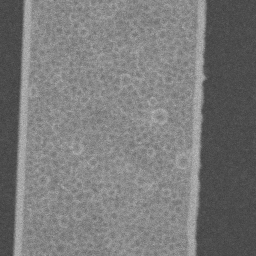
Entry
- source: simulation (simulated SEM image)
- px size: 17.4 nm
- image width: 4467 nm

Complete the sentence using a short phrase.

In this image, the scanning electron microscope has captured one or a few lines or trenches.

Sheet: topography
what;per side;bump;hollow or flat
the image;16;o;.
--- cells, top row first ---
..ooooooooooo...
..ooooooooooo...
..ooooooooooo...
..oooooooooo....
..oooooooooo....
..oooooooooo....
..oooooooooo....
.ooooooooooo....
.ooooooooooo....
.ooooooooooo....
.ooooooooooo....
.ooooooooooo....
.ooooooooooo....
.ooooooooooo....
.ooooooooooo....
.ooooooooooo....